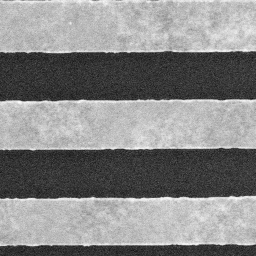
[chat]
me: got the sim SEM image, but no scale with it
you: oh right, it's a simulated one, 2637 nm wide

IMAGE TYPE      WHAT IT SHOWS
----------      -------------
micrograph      lines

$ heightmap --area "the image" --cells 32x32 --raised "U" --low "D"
UUUUUUUUUUUUUUUUUUUUUUUUUUUUUUUU
UUUUUUUUUUUUUUUUUUUUUUUUUUUUUUUU
UUUUUUUUUUUUUUUUUUUUUUUUUUUUUUUU
UUUUUUUUUUUUUUUUUUUUUUUUUUUUUUUU
UUUUUUUUUUUUUUUUUUUUUUUUUUUUUUUU
UUUUUUUUUUUUUUUUUUUUUUUUUUUUUUUU
DUDUDUUUUDDDDDUDUDDDDDDDDDDDDDDD
DDDDDDDDDDDDDDDDDDDDDDDDDDDDDDDD
DDDDDDDDDDDDDDDDDDDDDDDDDDDDDDDD
DDDDDDDDDDDDDDDDDDDDDDDDDDDDDDDD
DDDDDDDDDDDDDDDDDDDDDDDDDDDDDDDD
DDDDDDDDDDDDDDDDDDDDDDDDDDDDDDDD
DDDDDDDDDDDDDDDDDDDDDDDDDDDDDDDD
UUUUUUUUUUUUUUUUUUUUUUUUUUUUUUUU
UUUUUUUUUUUUUUUUUUUUUUUUUUUUUUUU
UUUUUUUUUUUUUUUUUUUUUUUUUUUUUUUU
UUUUUUUUUUUUUUUUUUUUUUUUUUUUUUUU
UUUUUUUUUUUUUUUUUUUUUUUUUUUUUUUU
UUUUUUUUUUUUUUUDUUUUDDDDDDDDDDDD
DDDDDDDDDDDDDDDDDDDDDDDDDDDDDDDD
DDDDDDDDDDDDDDDDDDDDDDDDDDDDDDDD
DDDDDDDDDDDDDDDDDDDDDDDDDDDDDDDD
DDDDDDDDDDDDDDDDDDDDDDDDDDDDDDDD
DDDDDDDDDDDDDDDDDDDDDDDDDDDDDDDD
DDDDDDDDDDDDDDDDDDDDDDDDDDDDDDDD
UUUUUUUUUUUUUUUUUUUUUUUUUUUUUUUU
UUUUUUUUUUUUUUUUUUUUUUUUUUUUUUUU
UUUUUUUUUUUUUUUUUUUUUUUUUUUUUUUU
UUUUUUUUUUUUUUUUUUUUUUUUUUUUUUUU
UUUUUUUUUUUUUUUUUUUUUUUUUUUUUUUU
UUUUUUUUUUUUUUUUUUUUUUUUUDDUDUUU
DDDDDDDDDDDDDDDDDDDDDDDDDDDDDDDD